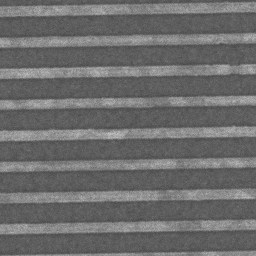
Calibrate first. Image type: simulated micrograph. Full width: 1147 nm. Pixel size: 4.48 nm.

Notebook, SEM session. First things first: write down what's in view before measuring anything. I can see parallel lines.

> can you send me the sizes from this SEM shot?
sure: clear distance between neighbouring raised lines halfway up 0.098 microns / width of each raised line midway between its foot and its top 40.3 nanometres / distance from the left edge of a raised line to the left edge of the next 139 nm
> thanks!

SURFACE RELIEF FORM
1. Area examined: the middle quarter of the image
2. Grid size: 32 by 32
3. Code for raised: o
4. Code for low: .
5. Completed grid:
..............................oo
oooooooooooooooooooooooooooooooo
oooooooooooooooooooooooooooooooo
................................
................................
................................
................................
................................
..........................oooooo
oooooooooooooooooooooooooooooooo
ooooooooooooooooooooooooo.......
................................
................................
................................
................................
................................
.........ooooooooooooooooooooooo
oooooooooooooooooooooooooooooooo
oooooooo.....oo.................
................................
................................
................................
................................
................................
oooooooooooooooooooooooooooooooo
oooooooooooooooooooooooooooooooo
ooooo...........................
................................
................................
................................
................................
................................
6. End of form